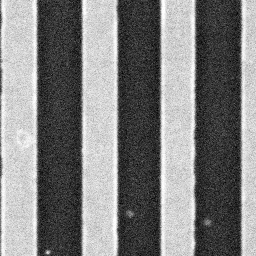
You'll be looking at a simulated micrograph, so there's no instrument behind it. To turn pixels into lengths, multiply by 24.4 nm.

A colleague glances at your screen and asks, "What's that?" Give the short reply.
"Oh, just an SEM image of lines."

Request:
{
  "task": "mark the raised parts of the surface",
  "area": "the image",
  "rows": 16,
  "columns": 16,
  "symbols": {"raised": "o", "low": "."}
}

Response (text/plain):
oo...oo...oo...o
oo...oo...oo...o
oo...oo...oo...o
oo...oo...oo...o
oo...oo...oo...o
oo...oo...oo...o
oo...oo...oo...o
oo...oo...oo...o
oo...oo...oo...o
oo...oo...oo...o
oo...oo...oo...o
oo...oo...oo...o
oo...oo...oo...o
oo...oo...oo...o
oo...oo...oo...o
oo...oo...oo...o